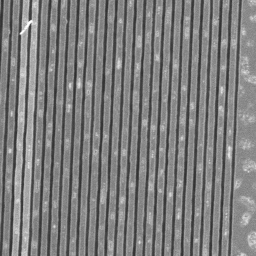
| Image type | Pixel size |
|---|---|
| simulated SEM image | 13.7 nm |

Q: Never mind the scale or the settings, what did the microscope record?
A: parallel lines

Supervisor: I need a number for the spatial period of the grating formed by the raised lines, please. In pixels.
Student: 9.51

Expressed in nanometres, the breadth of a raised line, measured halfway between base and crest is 80.5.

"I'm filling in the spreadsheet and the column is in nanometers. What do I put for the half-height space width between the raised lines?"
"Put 46.2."